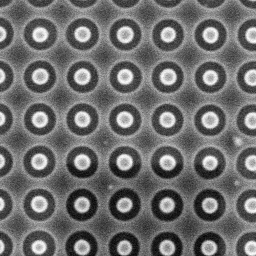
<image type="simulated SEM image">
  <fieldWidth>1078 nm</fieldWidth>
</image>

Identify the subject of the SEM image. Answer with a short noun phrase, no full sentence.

an array of small figures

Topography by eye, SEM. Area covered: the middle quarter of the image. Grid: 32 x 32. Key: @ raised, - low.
@@------@@@@------@@@@@------@@@
@---@---@@@@-------@@@---@@---@@
@--@@@---@@---@@@---@@--@@@@--@@
---@@@---@@--@@@@---@@--@@@@--@@
@--@@@---@@---@@---@@@---@@---@@
@-------@@@@-------@@@-------@@@
@@-----@@@@@@-----@@@@@------@@@
@@@@@@@@@@@@@@@@@@@@@@@@@--@@@@@
@@@@@@@@@@@@@@@@@@@@@@@@@@@@@@@@
@@@@@@@@@@@@@@@@@@@@@@@@@@@@@@@@
@@-----@@@@@@-----@@@@@@----@@@@
@-------@@@@-------@@@@------@@@
@--@@----@@---@@---@@@---@@---@@
---@@@---@@--@@@@---@@--@@@@--@@
---@@@---@@---@@@---@@--@@@@--@@
@---@----@@----@---@@@---@@---@@
@-------@@@@-------@@@-------@@@
@@-----@@@@@@-----@@@@@-----@@@@
@@@@@@@@@@@@@@@@@@@@@@@@@@@@@@@@
@@@@@@@@@@@@@@@@@@@@@@@@@@@@@@@@
@@@---@@@@@@@@--@@@@@@@@---@@@@@
@@-----@@@@@------@@@@@------@@@
@-------@@@@-------@@@-------@@@
@--@@@--@@@---@@@--@@@---@@---@@
---@@@---@@--@@@@---@---@@@@--@@
@--@@@---@@---@@@--@@@--@@@@--@@
@-------@@@--------@@@-------@@@
@@------@@@@-------@@@@------@@@
@@@@--@@@@@@@@----@@@@@@----@@@@
@@@@@@@@@@@@@@@@@@@@@@@@@@@@@@@@
@@@@@@@@@@@@@@@@@@@@@@@@@@@@@@@@
@@-----@@@@@@-----@@@@@@---@@@@@